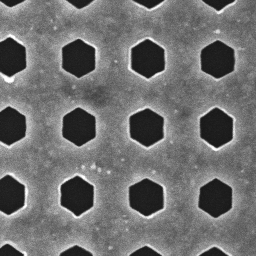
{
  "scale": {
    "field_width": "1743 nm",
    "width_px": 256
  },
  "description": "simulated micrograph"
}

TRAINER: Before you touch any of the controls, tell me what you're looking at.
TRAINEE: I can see a regular array of holes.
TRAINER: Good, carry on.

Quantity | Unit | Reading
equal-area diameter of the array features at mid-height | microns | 0.243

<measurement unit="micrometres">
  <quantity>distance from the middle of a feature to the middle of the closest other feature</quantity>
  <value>0.467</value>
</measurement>